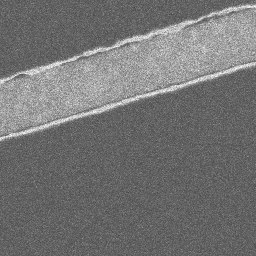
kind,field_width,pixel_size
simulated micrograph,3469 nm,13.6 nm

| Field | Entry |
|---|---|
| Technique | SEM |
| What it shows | one or a few lines or trenches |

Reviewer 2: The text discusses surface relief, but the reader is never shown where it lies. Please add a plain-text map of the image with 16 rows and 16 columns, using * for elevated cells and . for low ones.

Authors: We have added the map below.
***************.
************....
********........
*****...........
**............**
...........*****
.......*********
....************
.***************
****************
****************
****************
****************
****************
****************
****************